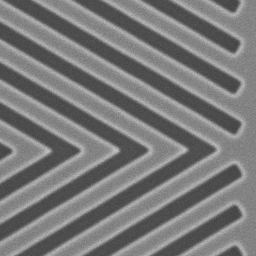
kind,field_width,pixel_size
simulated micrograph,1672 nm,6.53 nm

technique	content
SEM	groups of lines, slits or small figures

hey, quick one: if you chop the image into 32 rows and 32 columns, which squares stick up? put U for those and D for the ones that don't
UDDDDUUUUUDDDDUUUUDDDDUUUUUDDDUU
UUUDDDDUUUUDDDDUUUUUDDDDUUUUUUUU
UUUUDDDDUUUUUDDDDUUUUUDDDDUUUUUU
DUUUUUDDDDUUUUUDDDDUUUUUDDDUUUUU
DDDUUUUUDDDDUUUUUDDDUUUUUDDDDUUU
UDDDDUUUUUDDDUUUUUDDDDUUUUUDDDUU
UUUDDDDUUUUDDDDUUUUUDDDDUUUUUUUU
UUUUDDDDUUUUUDDDDUUUUUDDDDUUUUUU
DUUUUUDDDDUUUUUDDDDUUUUDDDDUUUUU
DDDUUUUUDDDDUUUUDDDDUUUUUDDDDUUU
UDDDDUUUUUDDDUUUUUDDDDUUUUUDDDUU
UUUDDDDUUUUDDDDUUUUUDDDDUUUUUDUU
UUUUDDDDUUUUUDDDDUUUUUDDDDUUUUUU
DUUUUUDDDDUUUUUDDDDUUUUDDDDUUUUU
DDDUUUUUDDDDUUUUDDDDUUUUUDDDDUUU
UDDDDUUUUUDDDUUUUUDDDDUUUUUDDDUU
UUUDDDUUUUUDDDDUUUUUDDDDUUUUUDUU
UUUUDDDDUUUUUDDDDUUUUUDDDUUUUUUU
DUUUUUDDDDUUUUUDDDUUUUUDDDDUUUUU
DUUUUUDDDUUUUUDDDDUUUUDDDDUUUUUU
UUUUDDDDUUUUDDDDUUUUUDDDUUUUUUUU
UUDDDDUUUUUDDDUUUUUDDDDUUUUDDDUU
UDDDUUUUUDDDDUUUUDDDDUUUUUDDDDUU
DDDUUUUDDDDUUUUUDDDDUUUUDDDDUUUU
DUUUUUDDDDUUUUDDDDUUUUUDDDUUUUUU
UUUUDDDDUUUUUDDDUUUUUDDDDUUUUUUU
UUDDDDUUUUUDDDDUUUUDDDDUUUUUDDUU
UDDDDUUUUDDDDUUUUUDDDUUUUUDDDDUU
DDDUUUUUDDDUUUUUDDDDUUUUDDDDUUUU
DUUUUUDDDDUUUUDDDDUUUUUDDDUUUUUU
UUUUDDDDUUUUUDDDUUUUUDDDDUUUUUUU
UUUDDDUUUUUDDDDUUUUDDDDUUUUUDDUU